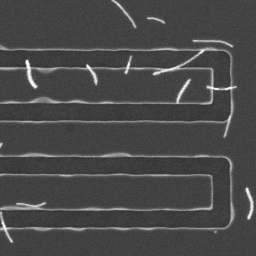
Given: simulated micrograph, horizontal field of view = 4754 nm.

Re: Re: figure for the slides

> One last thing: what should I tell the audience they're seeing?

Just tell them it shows groups of lines, slits or small figures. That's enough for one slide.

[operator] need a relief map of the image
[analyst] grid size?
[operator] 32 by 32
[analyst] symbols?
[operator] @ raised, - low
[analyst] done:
@@@@@@@@@@@@@@@@@@@@@@@@@@@@@@@@
@@@@@@@@@@@@@@@@@@@@@@@@@@@@@@@@
@@@@@@@@@@@@@@@@@@@@@@@@@@@@@@@@
@@@@@@@@@@@@@@@@@@@@@@@@@@@@@@@@
@@@@@@@@@@@@@@@@@@@@@@@@@@@@@@@@
@@@@@@@@@@@@@@@@@@@@@@@@@@@@@@@@
----------------------------@@@@
-----------------------------@@@
---@---@--@@---@@------------@@@
@@@@@@@@@@@@@@@@@@@@@@@@@@@--@@@
@@@@@@@@@@@@@@@@@@@@@@@@@@@--@@@
@@@@@@@@@@@@@@@@@@@@@@@@@@@--@@@
@@@@@@@@@@@@@@@@@@@@@@@@@@@--@@@
-----------------------------@@@
-----------------------------@@@
@@@@@@@@@@@@@@@@@@@@@@@@@@@@@@@@
@@@@@@@@@@@@@@@@@@@@@@@@@@@@@@@@
@@@@@@@@@@@@@@@@@@@@@@@@@@@@@@@@
@@@@@@@@@@@@@@@@@@@@@@@@@@@@@@@@
@--------@@@@---@-@@@@@@@@@@@@@@
-----------------------------@@@
-----------------------------@@@
@@@@@@@@@@@@@@@@@@@@@@@@@@@--@@@
@@@@@@@@@@@@@@@@@@@@@@@@@@@--@@@
@@@@@@@@@@@@@@@@@@@@@@@@@@@--@@@
@@@@@@@@@@@@@@@@@@@@@@@@@@@--@@@
-----------------------------@@@
-----------------------------@@@
@--@---------@-----@@-------@@@@
@@@@@@@@@@@@@@@@@@@@@@@@@@@@@@@@
@@@@@@@@@@@@@@@@@@@@@@@@@@@@@@@@
@@@@@@@@@@@@@@@@@@@@@@@@@@@@@@@@